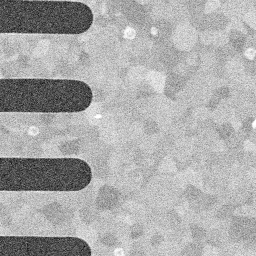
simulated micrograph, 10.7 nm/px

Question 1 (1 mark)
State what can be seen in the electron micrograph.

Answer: groups of lines, slits or small figures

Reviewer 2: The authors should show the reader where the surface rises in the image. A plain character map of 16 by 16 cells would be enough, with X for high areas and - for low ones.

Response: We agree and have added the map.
------XXXXXXXXXX
------XXXXXXXXXX
XXXXXXXXXXXXXXXX
XXXXXXXXXXXXXXXX
XXXXXXXXXXXXXXXX
------XXXXXXXXXX
------XXXXXXXXXX
XXXXXXXXXXXXXXXX
XXXXXXXXXXXXXXXX
XXXXXXXXXXXXXXXX
------XXXXXXXXXX
-----XXXXXXXXXXX
XXXXXXXXXXXXXXXX
XXXXXXXXXXXXXXXX
XXXXXXXXXXXXXXXX
------XXXXXXXXXX